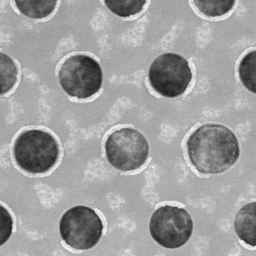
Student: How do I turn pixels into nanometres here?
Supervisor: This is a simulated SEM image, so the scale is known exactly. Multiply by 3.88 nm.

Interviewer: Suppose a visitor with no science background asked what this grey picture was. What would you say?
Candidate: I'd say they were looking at holes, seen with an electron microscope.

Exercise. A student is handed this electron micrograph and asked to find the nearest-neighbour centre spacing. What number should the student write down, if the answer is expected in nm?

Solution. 334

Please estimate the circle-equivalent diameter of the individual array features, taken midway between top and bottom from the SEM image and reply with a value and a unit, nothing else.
170 nanometers